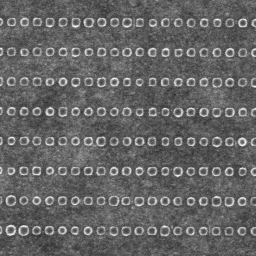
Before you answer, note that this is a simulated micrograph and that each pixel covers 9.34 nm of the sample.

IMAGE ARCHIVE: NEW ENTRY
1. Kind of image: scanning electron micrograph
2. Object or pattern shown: a regular array of raised bodies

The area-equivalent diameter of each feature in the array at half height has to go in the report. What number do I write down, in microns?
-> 0.0778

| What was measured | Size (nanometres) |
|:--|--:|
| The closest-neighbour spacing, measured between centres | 119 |